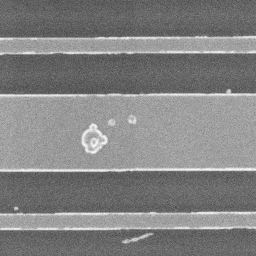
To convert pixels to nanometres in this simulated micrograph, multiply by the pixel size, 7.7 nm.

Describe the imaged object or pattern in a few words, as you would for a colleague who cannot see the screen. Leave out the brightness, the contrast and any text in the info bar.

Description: lines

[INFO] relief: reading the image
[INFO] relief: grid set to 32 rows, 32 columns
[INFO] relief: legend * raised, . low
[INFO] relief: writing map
................................
................................
................................
................................
................................
********************************
********************************
................................
................................
................................
................................
................................
********************************
********************************
********************************
********************************
********************************
********************************
********************************
********************************
********************************
................................
................................
................................
................................
................................
................................
********************************
*****************************...
................................
................................
................................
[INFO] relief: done